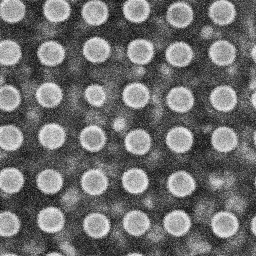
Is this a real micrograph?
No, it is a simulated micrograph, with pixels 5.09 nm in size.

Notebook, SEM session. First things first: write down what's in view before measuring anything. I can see a regular array of raised bodies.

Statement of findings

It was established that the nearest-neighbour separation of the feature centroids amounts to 205 nm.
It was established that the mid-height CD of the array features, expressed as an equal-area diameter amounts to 120 nanometers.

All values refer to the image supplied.